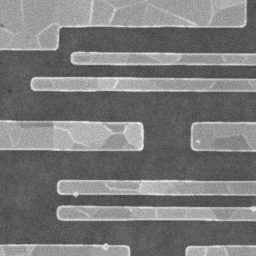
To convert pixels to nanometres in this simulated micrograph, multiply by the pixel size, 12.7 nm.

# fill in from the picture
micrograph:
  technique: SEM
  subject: wiring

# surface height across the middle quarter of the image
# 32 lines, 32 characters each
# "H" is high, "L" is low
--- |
LLLLLLLLLLLLLLLLLLLLLLLLLLLLLLLL
LLLLLLLLLLLLLLLLLLLLLLLLLLLLLLLL
LLLLLLLLLLLLLLLLLLLLLLLLLLLLLLLL
HHHHHHHHLLLLLLLLLLLLLLLLLLLLLLLL
HHHHHHHHHHHHHHHHHHHHHHHHHHHHHHHH
HHHHHHHHHHHHHHHHHHHHHHHHHHHHHHHH
HHHHHHHHHHHHHHHHHHHHHHHHHHHHHHHH
LLLLLLLLLLLLLLLLLLLLLLLLLLLLLLLL
LLLLLLLLLLLLLLLLLLLLLLLLLLLLLLLL
LLLLLLLLLLLLLLLLLLLLLLLLLLLLLLLL
LLLLLLLLLLLLLLLLLLLLLLLLLLLLLLLL
LLLLLLLLLLLLLLLLLLLLLLLLLLLLLLLL
LLLLLLLLLLLLLLLLLLLLLLLLLLLLLLLL
LLLLLLLLLLLLLLLLLLLLLLLLLLLLLLLL
HHHHLLLLLLLLLLLLLLLLLLLLLLLLLLLL
HHHHHHHHHHHHHHHHHHHHLLLLLLLLLLLL
HHHHHHHHHHHHHHHHHHHHLLLLLLLLLLLL
HHHHHHHHHHHHHHHHHHHHLLLLLLLLLLLL
HHHHHHHHHHHHHHHHHHHHLLLLLLLLLLLL
HHHHHHHHHHHHHHHHHHHHLLLLLLLLLLLL
HHHHHHHHHHHHHHHHHHHHLLLLLLLLLLLL
HHHHHHHHHHHHHHHHHHHLLLLLLLLLLLLL
LLLLLLLLLLLLLLLLLLLLLLLLLLLLLLLL
LLLLLLLLLLLLLLLLLLLLLLLLLLLLLLLL
LLLLLLLLLLLLLLLLLLLLLLLLLLLLLLLL
LLLLLLLLLLLLLLLLLLLLLLLLLLLLLLLL
LLLLLLLLLLLLLLLLLLLLLLLLLLLLLLLL
LLLLLLLLLLLLLLLLLLLLLLLLLLLLLLLL
LLLLLLLLLLLLLLLLLLLLLLLLLLLLLLLL
HHHHHHHHHHHHHHHHHHHHHHHHHHHHHHHH
HHHHHHHHHHHHHHHHHHHHHHHHHHHHHHHH
HHHHHHHHHHHHHHHHHHHHHHHHHHHHHHHH